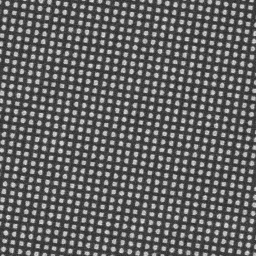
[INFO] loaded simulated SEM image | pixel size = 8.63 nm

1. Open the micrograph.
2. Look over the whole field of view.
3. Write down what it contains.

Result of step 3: a regular array of raised bodies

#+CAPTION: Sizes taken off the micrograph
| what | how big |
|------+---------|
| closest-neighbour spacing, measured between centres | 67.7 nanometres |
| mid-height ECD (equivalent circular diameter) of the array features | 4.51 px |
